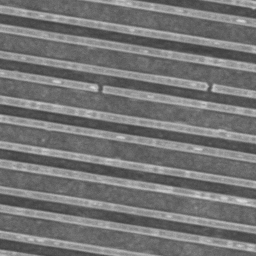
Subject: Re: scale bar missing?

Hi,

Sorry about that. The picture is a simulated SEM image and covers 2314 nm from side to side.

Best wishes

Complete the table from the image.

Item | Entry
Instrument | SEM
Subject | parallel lines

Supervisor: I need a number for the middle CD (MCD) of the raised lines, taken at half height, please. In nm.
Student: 67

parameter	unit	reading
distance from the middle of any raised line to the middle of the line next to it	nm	201